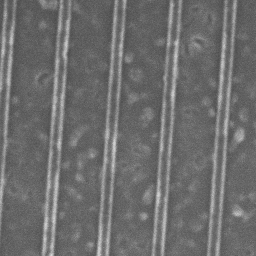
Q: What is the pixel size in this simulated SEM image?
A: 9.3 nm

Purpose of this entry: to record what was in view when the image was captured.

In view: parallel lines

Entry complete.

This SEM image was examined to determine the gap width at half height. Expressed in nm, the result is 428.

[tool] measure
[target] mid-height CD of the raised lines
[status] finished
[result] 0.0834 micrometres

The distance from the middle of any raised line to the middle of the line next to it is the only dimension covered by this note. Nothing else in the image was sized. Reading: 511 nanometers